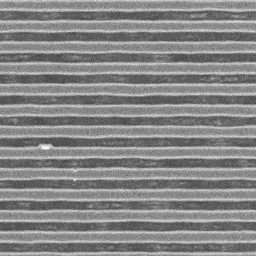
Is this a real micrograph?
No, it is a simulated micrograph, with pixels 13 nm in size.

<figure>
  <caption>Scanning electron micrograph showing parallel lines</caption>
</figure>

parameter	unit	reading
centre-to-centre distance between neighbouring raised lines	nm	274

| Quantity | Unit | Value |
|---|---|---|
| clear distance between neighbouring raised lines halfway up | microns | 0.123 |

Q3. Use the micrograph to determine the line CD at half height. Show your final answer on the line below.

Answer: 148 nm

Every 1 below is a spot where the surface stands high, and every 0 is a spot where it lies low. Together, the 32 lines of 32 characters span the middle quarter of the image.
11111111111111111111111111111111
11111111111111111111111111111111
11111111000000000000000000000000
00000000000000000000000000000000
00000000000000000000000000000000
11111111111111111111111111111111
11111111111111111111111111111111
11111111111111111111111111111111
00000000000000000000000000000000
00000000000000000000000000000000
11111111111111111111111111111111
11111111111111111111111111111111
11111111111111111111111111111111
00000000000000000000000000000000
00000000000000000000000000000000
00000000001000000000000000000000
11111111111111111111111111111111
11111111111111111111111111111111
00000000000000000000000000000000
00000000000000000000000000000000
00000000000000000000000000000000
11111111111111111111111111111111
11111111111111111111111111111111
11111000001100000000011111111000
00000000000000000000000000000000
00000000000000000000000000000000
11111111111111111111111111111111
11111111111111111111111111111111
11111111111111111111111111111111
00000000000000000000000000000000
00000000000000000000000000000000
11111111111111111111111111111111